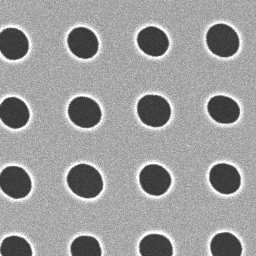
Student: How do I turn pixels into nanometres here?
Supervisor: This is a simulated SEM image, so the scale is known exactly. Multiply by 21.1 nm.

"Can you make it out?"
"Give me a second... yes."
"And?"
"a regular array of holes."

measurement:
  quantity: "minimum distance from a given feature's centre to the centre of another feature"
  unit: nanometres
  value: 1460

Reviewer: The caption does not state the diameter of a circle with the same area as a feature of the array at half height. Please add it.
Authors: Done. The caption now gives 676 nm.